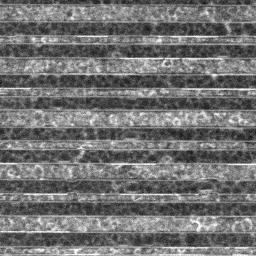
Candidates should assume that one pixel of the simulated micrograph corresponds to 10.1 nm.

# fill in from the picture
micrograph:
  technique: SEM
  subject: parallel lines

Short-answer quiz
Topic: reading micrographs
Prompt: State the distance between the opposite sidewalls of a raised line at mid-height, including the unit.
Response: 147 nanometres